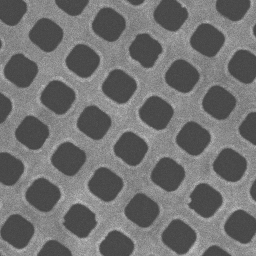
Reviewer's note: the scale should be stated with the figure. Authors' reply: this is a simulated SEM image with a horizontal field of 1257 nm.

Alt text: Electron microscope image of a regular array of holes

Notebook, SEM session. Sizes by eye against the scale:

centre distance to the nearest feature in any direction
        217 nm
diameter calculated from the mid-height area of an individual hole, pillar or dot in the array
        157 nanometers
